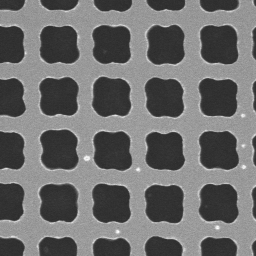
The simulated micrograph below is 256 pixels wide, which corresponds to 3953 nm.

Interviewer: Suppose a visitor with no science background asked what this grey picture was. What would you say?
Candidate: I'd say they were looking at a regular array of holes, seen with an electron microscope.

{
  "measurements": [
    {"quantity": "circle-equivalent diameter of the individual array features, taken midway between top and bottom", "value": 635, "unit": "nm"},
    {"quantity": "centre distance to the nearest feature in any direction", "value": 810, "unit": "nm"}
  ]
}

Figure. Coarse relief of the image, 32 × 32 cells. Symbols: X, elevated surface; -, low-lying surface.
---XX-----XX----XX-----XX-----XX
XXXXXXXXXXXXXXXXXXXXXXXXXXXXXXXX
XXXXXXXXXXXXXXXXXXXXXXXXXXXXXXXX
--XXXX---XXX----XXX----XX----XXX
---XX-----XX----XX-----XX-----XX
---XX-----XX----XXX----XX-----XX
---XX-----XX----XX-----XX-----XX
---XXX----XX----XXX----XXX----XX
XXXXXXXXXXXXXXXXXXXXXXXXXXXXXXXX
XXXXXXXXXXXXXXXXXXXXXXXXXXXXXXXX
---XX-----XX----XX-----XX----XXX
---XX-----XX----XX-----XX-----XX
---XX-----XX----XX-----XX-----XX
---XX-----XX----XX-----XX-----XX
X-XXXXXXXXXXX-XXXXX---XXXX---XXX
XXXXXXXXXXXXXXXXXXXXXXXXXXXXXXXX
XXXXXX---XXX--XXXXXXXXXXXX---XXX
---XX-----XX----XX-----XX----XX-
---XX-----XX----XX-----XX-----XX
---XX-----XX----XX-----XX-----XX
---XX-----XX----XX-----XX-----XX
XXXXXXXXXXXXXXXXXXXXXXXXXXXXXXXX
XXXXXXXXXXXXXXXXXXXXXXXXXXXXXXXX
---XX----XXX----XXX----XX----XXX
---XX-----XX----XX-----XX-----X-
---XX-----XX----XX-----XX-----XX
---XX-----XX----XX-----XX-----XX
X-XXXX---XXX----XXX----XXX---XXX
XXXXXXXXXXXXXXXXXXXXXXXXXXXXXXXX
XXXXXXXXXXXXXXXXXXXXXXXXXXXXXXXX
---XX-----XX----XX----XXX----XXX
---XX-----XX----XX-----XX-----XX